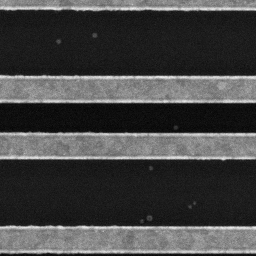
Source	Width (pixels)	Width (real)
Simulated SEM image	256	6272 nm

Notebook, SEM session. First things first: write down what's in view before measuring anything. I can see lines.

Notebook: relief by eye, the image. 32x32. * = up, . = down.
********************************
................................
................................
................................
................................
................................
................................
................................
................................
................................
********************************
********************************
********************************
................................
................................
................................
................................
********************************
********************************
********************************
................................
................................
................................
................................
................................
................................
................................
................................
********************************
********************************
********************************
********************************